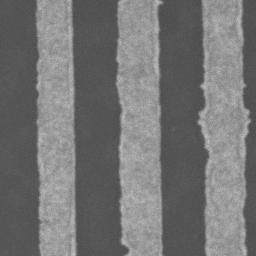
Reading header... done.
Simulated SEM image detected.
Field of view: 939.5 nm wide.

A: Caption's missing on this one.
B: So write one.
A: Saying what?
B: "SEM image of one or a few lines or trenches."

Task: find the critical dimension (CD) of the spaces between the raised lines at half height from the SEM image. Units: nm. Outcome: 171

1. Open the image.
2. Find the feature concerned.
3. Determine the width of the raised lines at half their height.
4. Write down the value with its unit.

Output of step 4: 36.8 pixels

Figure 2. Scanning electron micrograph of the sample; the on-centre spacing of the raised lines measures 308 nm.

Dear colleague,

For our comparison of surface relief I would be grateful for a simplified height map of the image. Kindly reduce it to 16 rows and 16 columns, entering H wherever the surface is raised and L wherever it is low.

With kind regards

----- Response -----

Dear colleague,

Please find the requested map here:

LLHHLLLHHHLLLHHL
LLHHHLLHHHLLLHHL
LLHHLLLHHHLLLHHL
LLHHLLLHHHLLLHHL
LLHHHLLHHHLLLHHL
LLHHHLLHHHLLLHHL
LLHHHLLLHHLLLHHL
LLHHHLLLHHLLLHHH
LLHHHLLLHHLLLHHL
LLHHHLLLHHLLLHHL
LLHHHLLLHHLLLHHL
LLLHHLLLHHLLLHHL
LLLHHLLLHHLLLHHL
LLLHHLLLHHLLLHHL
LLLHHLLLHHLLLHHL
LLLHHLLLHHLLLHHL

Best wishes